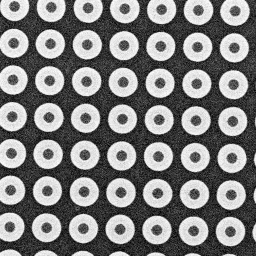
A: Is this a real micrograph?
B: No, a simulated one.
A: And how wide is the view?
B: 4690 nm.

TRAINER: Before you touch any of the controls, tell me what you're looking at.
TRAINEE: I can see an array of small figures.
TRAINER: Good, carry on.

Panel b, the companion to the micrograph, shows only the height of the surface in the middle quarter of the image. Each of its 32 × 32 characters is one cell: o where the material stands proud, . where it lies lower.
................................
...ooooo.....ooo.......ooo......
...oooooo...oooooo...oooooo....o
..ooooooo..ooooooo...oooooo...oo
..ooooooo..ooooooo...ooooooo..oo
..ooooooo..ooooooo...ooooooo..oo
...ooooo....oooooo...oooooo...oo
....ooo......oooo.....oooo.....o
................................
................................
....ooo......ooo.......oo.......
..oooooo....ooooo....ooooo.....o
..ooooooo..ooooooo...oooooo...oo
..ooooooo..ooooooo..ooooooo...oo
..ooooooo..ooooooo..ooooooo...oo
..oooooo...ooooooo...oooooo...oo
...ooooo....ooooo....ooooo....oo
........................o.......
................................
....ooo......o..................
...ooooo....ooooo....ooooo.....o
..ooooooo..ooooooo..ooooooo...oo
..ooooooo..ooooooo..ooooooo..ooo
..ooooooo..ooooooo..ooooooo..ooo
..oooooo...ooooooo..ooooooo..ooo
...ooooo....ooooo....ooooo....oo
..............o.......ooo......o
................................
....o...........................
..oooooo....ooooo....ooooo.....o
..oooooo...oooooo...oooooo....oo
..ooooooo..ooooooo..ooooooo..ooo